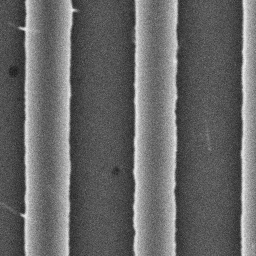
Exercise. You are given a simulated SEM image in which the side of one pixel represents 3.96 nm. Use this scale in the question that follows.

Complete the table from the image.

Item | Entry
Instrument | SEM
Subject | lines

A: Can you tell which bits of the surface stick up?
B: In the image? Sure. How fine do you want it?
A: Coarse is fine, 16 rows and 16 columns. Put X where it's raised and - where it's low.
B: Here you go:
--XX-----XX----X
--XX-----XX----X
--XX-----XX----X
--XX----XXX----X
--XX----XXX----X
--XX----XXX----X
--XX----XXX----X
--XX----XXX----X
--XX----XXX----X
--XX----XXX----X
--XX----XXX----X
--XX----XXX----X
--XX----XXX----X
--XX----XXX----X
--XX----XXX----X
--XX----XXX----X